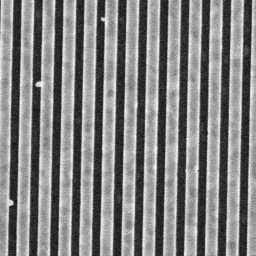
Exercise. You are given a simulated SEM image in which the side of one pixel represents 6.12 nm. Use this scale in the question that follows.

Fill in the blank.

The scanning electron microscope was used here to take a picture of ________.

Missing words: parallel lines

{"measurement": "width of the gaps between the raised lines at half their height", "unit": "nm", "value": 57.4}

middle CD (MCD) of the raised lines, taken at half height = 72.7 nanometers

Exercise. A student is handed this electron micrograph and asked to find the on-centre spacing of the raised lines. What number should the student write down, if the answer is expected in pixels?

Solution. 21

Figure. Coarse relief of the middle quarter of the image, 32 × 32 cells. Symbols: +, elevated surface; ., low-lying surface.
++...+++..+++..+++...+++..+++..+
++...+++..+++...++...+++..+++..+
++...+++..+++...++...++...+++..+
++...+++..+++...++...++...+++..+
++...+++..+++...++...++...+++..+
++...+++..+++...++...++...+++..+
++...+++..+++...++...++...+++..+
++...+++..+++...++...++...+++..+
++...+++..+++..+++...++...++...+
++...+++..+++..+++...++...++...+
++...+++..+++..+++...++...++...+
++...+++..+++..+++...++...++...+
++...++...+++..+++...++...++...+
++...++...+++..+++...++...++...+
++...++...+++..+++..+++...++...+
++...++...+++..+++..+++...++...+
++...++...+++..+++..+++...++...+
++...++...+++..+++..+++...++...+
++...++...++...+++..+++...++...+
++...++...++...+++..+++..+++...+
++...++...++...+++..+++..+++...+
++...++...++...+++..+++..+++...+
++...++...++...+++..+++..+++...+
++...++...++...+++..+++..+++...+
++..+++...++...+++..+++..+++...+
++..+++...++...+++..+++..+++...+
++..+++...++...+++..+++..+++..++
++..+++...++...+++..+++..+++...+
++..+++...++...+++..+++..+++...+
++..+++...++...+++..+++..+++...+
++..+++...++...+++..+++..+++...+
++..+++...++...+++..+++..+++...+